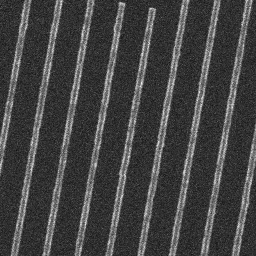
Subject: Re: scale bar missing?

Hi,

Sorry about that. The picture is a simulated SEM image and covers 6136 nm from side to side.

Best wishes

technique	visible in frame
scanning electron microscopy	parallel lines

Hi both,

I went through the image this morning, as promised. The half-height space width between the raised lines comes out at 608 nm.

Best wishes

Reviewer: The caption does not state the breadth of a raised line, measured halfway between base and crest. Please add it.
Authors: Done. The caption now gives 144 nm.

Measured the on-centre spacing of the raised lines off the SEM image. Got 746 nm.